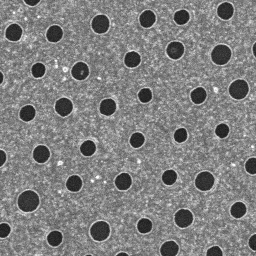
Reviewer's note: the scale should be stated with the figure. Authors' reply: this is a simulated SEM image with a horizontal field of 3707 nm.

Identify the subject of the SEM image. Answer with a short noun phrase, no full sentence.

a regular array of holes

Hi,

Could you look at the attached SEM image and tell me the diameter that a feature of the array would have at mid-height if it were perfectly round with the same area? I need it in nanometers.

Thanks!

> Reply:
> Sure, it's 254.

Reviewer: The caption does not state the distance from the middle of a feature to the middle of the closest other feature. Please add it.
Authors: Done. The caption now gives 0.574 micrometres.